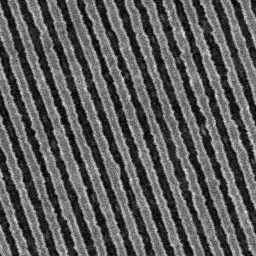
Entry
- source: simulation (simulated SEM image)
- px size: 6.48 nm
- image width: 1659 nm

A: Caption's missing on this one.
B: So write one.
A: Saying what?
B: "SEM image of parallel lines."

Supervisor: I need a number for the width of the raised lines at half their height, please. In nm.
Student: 54.2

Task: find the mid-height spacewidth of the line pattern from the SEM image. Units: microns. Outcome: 0.0626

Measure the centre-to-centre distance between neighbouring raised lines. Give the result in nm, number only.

118